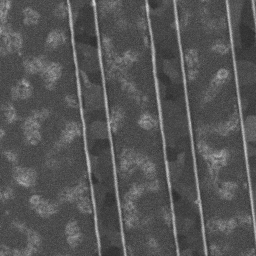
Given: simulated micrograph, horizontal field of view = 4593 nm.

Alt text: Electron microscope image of one or a few lines or trenches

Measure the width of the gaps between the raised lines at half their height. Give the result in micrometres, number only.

0.926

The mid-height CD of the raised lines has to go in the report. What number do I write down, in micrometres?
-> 0.481